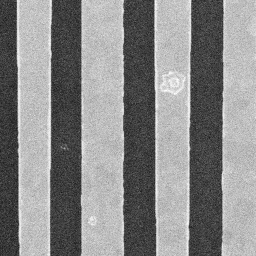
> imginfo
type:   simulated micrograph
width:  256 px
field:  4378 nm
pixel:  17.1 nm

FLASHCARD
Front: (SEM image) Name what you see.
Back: lines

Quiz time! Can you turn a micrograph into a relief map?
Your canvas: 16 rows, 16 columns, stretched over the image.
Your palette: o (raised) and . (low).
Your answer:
.oo..ooo..oo..oo
.oo..ooo..oo..oo
.oo..ooo..oo..oo
.oo..ooo..oo..oo
.oo..ooo..oo..oo
.oo..ooo..oo..oo
.oo..ooo..oo..oo
.oo..ooo..oo..oo
.oo..ooo..oo..oo
.oo..ooo..oo..oo
.oo..ooo..oo..oo
.oo..ooo..oo..oo
.oo..ooo..oo..oo
.oo..ooo..oo..oo
.oo..ooo..oo..oo
.oo..ooo..oo..oo